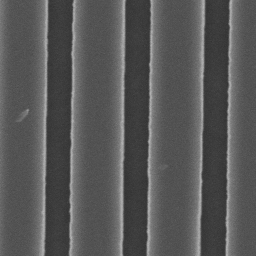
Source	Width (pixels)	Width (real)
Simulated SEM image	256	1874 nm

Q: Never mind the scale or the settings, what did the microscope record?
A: lines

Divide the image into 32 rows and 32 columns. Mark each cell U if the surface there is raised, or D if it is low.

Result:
UUUUUUDDDUUUUUUUDDDUUUUUUUDDDUUU
UUUUUUDDDUUUUUUUDDDUUUUUUUDDDUUU
UUUUUUDDDUUUUUUUDDDUUUUUUUDDDUUU
UUUUUUDDDUUUUUUUDDDUUUUUUUDDDUUU
UUUUUUDDDUUUUUUUDDDUUUUUUDDDDUUU
UUUUUUDDDUUUUUUUDDDUUUUUUDDDDUUU
UUUUUUDDDUUUUUUUDDDUUUUUUDDDDUUU
UUUUUUDDDUUUUUUUDDDUUUUUUDDDDUUU
UUUUUUDDDUUUUUUUDDDUUUUUUDDDDUUU
UUUUUUDDDUUUUUUDDDDUUUUUUDDDDUUU
UUUUUUDDDUUUUUUDDDDUUUUUUDDDDUUU
UUUUUUDDDUUUUUUDDDDUUUUUUDDDDUUU
UUUUUUDDDUUUUUUDDDDUUUUUUDDDDUUU
UUUUUUDDDUUUUUUDDDDUUUUUUDDDUUUU
UUUUUUDDDUUUUUUDDDDUUUUUUDDDUUUU
UUUUUUDDDUUUUUUDDDDUUUUUUDDDUUUU
UUUUUUDDDUUUUUUDDDDUUUUUUDDDUUUU
UUUUUUDDDUUUUUUDDDDUUUUUUDDDUUUU
UUUUUUDDDUUUUUUDDDDUUUUUUDDDUUUU
UUUUUUDDDUUUUUUDDDDUUUUUUDDDUUUU
UUUUUUDDDUUUUUUDDDDUUUUUUDDDUUUU
UUUUUUDDDUUUUUUDDDDUUUUUUDDDUUUU
UUUUUUDDDUUUUUUDDDDUUUUUUDDDUUUU
UUUUUUDDDUUUUUUDDDDUUUUUUDDDUUUU
UUUUUUDDDUUUUUUDDDDUUUUUUDDDUUUU
UUUUUUDDDUUUUUUDDDDUUUUUUDDDUUUU
UUUUUUDDDUUUUUUDDDDUUUUUUDDDUUUU
UUUUUUDDDUUUUUUDDDDUUUUUUDDDUUUU
UUUUUUDDDUUUUUUDDDUUUUUUUDDDUUUU
UUUUUUDDDUUUUUUDDDDUUUUUUDDDUUUU
UUUUUDDDDUUUUUUDDDUUUUUUUDDDUUUU
UUUUUDDDDUUUUUUDDDUUUUUUUDDDUUUU